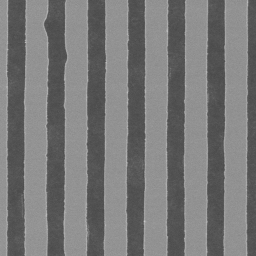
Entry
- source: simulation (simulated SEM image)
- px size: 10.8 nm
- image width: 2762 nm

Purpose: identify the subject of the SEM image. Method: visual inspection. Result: parallel lines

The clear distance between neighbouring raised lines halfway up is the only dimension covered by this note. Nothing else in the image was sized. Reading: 186 nm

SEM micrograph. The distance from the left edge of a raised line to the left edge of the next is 431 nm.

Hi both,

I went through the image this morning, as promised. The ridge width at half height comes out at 243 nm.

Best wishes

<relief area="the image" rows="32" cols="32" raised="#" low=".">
#..###..###..###..###..###..###.
#..###..###..###..###..###..###.
#..###..###..###..###..###..###.
#..###..###..###..###..###..###.
#..###..###..###..###..###..###.
#..###..###..###..###..###..###.
#..###..###..###..###..###..###.
#..###..###..###..###..###..###.
#..###..###..###..###..###..###.
#..###..###..###..###..###..###.
#..###..###..###..###..###..###.
#..###..###..###..###..###..###.
#..###..###..###..###..###..###.
#..###..###..###..###..###..###.
#..###..###..###..###..###..###.
#..###..###..###..###..###..###.
#..###..###..###..###..###..###.
#..###..###..###..###..###..###.
#..###..###..###..###..###..###.
#..###..###..###..###..###..###.
#..###..###..###.####..###..###.
#..###..###..###..###..###..###.
#..###..###..###..###..###..###.
#..###..###..###..###..###..###.
#..###..###..###..###..###..###.
#..###..###..###..###..###..###.
#..###..###..###..###..###..###.
#..###..###..###..###..###..###.
#..###..###..###..###..###..###.
#..###..###..###..###..###..###.
#..###..###..###..###..###..###.
#..###..###..###..###..###..###.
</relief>